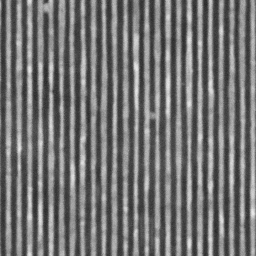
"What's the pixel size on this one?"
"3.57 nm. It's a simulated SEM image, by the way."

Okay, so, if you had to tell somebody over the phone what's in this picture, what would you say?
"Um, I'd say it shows parallel lines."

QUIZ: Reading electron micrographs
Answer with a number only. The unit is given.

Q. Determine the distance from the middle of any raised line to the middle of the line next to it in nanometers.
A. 38.1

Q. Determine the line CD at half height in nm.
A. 13.9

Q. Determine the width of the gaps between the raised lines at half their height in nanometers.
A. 24.6